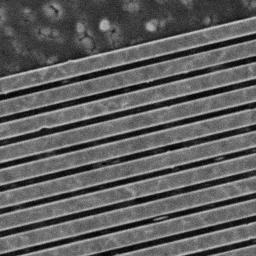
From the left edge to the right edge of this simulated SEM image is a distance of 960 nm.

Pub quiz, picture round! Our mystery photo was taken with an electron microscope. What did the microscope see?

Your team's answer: parallel lines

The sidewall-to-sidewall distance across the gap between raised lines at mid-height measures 28.3 nanometres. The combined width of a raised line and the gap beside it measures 0.0832 microns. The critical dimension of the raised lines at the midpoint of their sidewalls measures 56.6 nanometres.